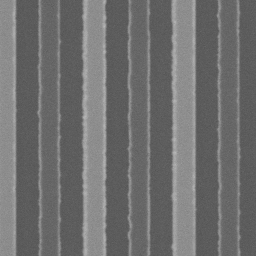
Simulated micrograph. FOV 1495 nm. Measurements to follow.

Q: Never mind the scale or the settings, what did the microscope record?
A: lines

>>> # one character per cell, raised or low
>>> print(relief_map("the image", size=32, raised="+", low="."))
++...++....++...+++...++...+++..
++...++...+++...+++...++...+++..
++...++...+++...+++...++...+++..
++...++....++...+++...++...+++..
++...++...+++...+++...++...+++..
++...+++..+++...+++...++...+++..
++...++...+++...+++...++...+++..
++...++...+++...+++...++...+++..
++...++....++...+++...++...+++..
++...+++..+++...+++...++...+++..
++...++...+++...+++...++...+++..
++...++...+++...+++...++...+++..
++...++...+++...+++...++...+++..
++...++...+++...+++...++...+++..
++...+++..+++...+++...++...+++..
++...+++..+++...+++...++...+++..
++...++...+++...+++...++...+++..
++...++...+++...+++...++...+++..
++...++...+++...+++...++...+++..
++...++....++...+++...++...+++..
++...++....++...+++...++...+++..
++...+++..+++...+++...++...+++..
++...++...+++...+++...++...+++..
++...+++..+++...+++...++...+++..
++...+++..+++...+++...++...+++..
++...+++...++...+++...++...+++..
++...++....++...+++...++...+++..
++...+++...++...+++...++...+++..
++...++...+++...+++...++...+++..
++...++...+++...+++...++...+++..
++...+++...++...+++...++...+++..
++...+++...++...+++...++...+++..